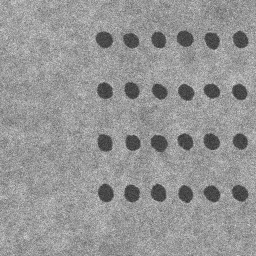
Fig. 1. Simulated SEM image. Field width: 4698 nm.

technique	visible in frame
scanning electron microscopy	a regular array of holes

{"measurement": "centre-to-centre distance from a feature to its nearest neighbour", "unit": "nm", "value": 486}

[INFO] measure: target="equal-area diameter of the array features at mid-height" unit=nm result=315